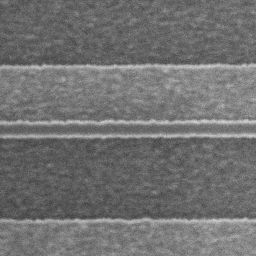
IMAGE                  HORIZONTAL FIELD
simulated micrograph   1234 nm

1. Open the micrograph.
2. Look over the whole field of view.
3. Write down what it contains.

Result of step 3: lines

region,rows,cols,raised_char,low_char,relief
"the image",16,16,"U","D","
DDDDDDDDDDDDDDDD
DDDDDDDDDDDDDDDD
DDDDDDDDDDDDDDDD
DDDDDDDDDDDDDDDD
UUUUUUUUUUUUUUUU
UUUUUUUUUUUUUUUU
UUUUUUUUUUUUUUUU
UUUUUUUUUUUUUUUU
UUUUUUUUUUUUDUUU
DDDDDDDDDDDDDDDD
DDDDDDDDDDDDDDDD
DDDDDDDDDDDDDDDD
DDDDDDDDDDDDDDDD
DDDDDDDDDDDDDDDD
UUUUUUUUUUUUUUUU
UUUUUUUUUUUUUUUU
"